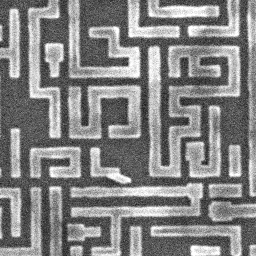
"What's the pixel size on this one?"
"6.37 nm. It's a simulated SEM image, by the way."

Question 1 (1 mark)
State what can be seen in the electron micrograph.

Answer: wiring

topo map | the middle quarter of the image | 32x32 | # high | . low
.###............###..###..###..#
.##################..###..###..#
.##################...##..###..#
......................##........
......................##........
.....................###........
.###..#############..###..######
.###..#############..###..######
.###..###.......###..###..###...
.###..###.......###...##..###...
.###..###.......###...##..###...
.###..###.......###...##..######
.###..###.......###...##..######
.###..###.......###...##.......#
.###..###.......###...##........
.###..###...##..###...##.......#
.########..########...##..######
.########..########...##..######
......................##..###...
......................##..###...
......................##..###..#
####...##.............##...##..#
####...##.............##...##..#
..##...##.............##...##..#
..##...##.............##...##..#
..##...##.............##..###...
####...#######........#######...
####...#######........#######...
............####................
..............##................
...............................#
..##############################